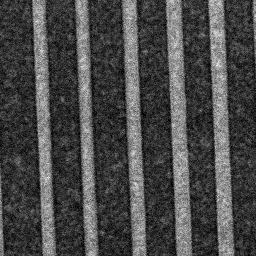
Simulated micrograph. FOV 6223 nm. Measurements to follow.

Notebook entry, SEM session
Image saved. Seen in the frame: parallel lines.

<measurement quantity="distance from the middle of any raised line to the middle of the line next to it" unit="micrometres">1.07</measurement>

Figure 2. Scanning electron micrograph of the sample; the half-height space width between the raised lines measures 744 nm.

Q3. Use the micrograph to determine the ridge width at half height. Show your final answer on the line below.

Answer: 0.319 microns